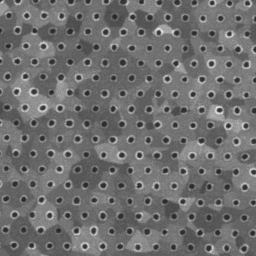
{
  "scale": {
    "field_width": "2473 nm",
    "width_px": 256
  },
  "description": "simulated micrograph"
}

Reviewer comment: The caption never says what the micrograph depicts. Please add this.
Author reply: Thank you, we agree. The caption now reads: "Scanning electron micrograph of a regular array of holes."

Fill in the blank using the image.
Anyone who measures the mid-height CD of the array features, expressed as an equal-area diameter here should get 0.0577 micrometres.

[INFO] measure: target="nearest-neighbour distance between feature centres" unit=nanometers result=166